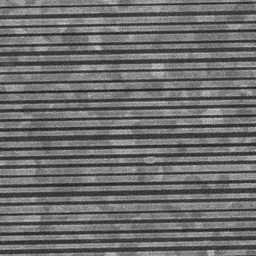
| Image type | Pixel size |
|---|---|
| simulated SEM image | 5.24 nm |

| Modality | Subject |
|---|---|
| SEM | parallel lines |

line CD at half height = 28.8 nanometers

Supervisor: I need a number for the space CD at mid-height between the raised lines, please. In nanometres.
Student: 19.7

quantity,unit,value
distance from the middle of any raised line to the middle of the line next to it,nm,49.4